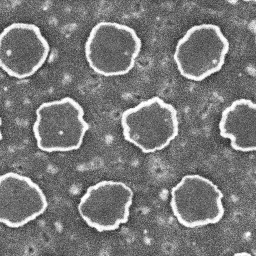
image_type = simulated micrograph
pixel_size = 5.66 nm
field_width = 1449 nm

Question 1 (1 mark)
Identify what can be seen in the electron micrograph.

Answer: raised bodies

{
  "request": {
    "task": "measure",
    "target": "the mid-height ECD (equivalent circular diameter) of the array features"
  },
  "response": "51.8 px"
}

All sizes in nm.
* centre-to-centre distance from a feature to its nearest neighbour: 505